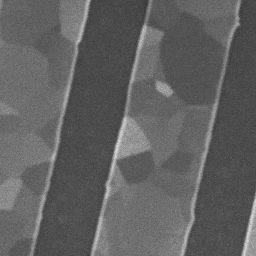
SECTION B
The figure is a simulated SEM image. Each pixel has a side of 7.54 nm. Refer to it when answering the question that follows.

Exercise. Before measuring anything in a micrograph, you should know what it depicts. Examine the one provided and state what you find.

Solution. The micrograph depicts one or a few lines or trenches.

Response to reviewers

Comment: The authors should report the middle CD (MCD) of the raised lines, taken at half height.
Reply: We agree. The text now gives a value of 663 nm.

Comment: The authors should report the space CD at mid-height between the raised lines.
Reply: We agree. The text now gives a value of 447 nm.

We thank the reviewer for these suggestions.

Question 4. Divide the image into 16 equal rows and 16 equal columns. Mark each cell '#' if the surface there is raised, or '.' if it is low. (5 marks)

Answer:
#####....######.
#####....######.
#####....#####..
#####....#####..
#####...######..
####....######..
####....######..
####....#####...
####....#####...
###....######...
###....######...
###....#####....
###....#####....
###...######....
##....######....
##....#####....#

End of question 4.